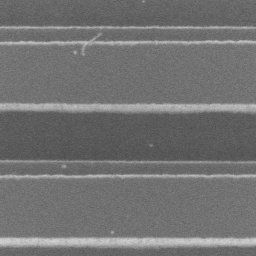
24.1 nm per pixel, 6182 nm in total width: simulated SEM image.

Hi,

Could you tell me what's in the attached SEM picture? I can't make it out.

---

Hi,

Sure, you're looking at lines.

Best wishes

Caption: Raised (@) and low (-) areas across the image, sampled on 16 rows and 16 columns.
----------------
----------------
@@@@@@@@@@@@@@@@
@@@@@@@@@@@@@@@@
@@@@@@@@@@@@@@@@
@@@@@@@@@@@@@@@@
@@@@@@@@@@@@@@@@
----------------
----------------
----------------
@@@@@@@@@@@@@@@@
@@@@@@@@@@@@@@@@
@@@@@@@@@@@@@@@@
@@@@@@@@@@@@@@@@
@@@@@@@@@@@@@@@@
----------------